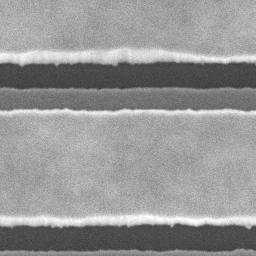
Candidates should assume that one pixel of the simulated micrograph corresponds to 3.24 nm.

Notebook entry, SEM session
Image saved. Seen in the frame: lines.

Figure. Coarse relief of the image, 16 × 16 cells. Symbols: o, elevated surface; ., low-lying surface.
oooooooooooooooo
oooooooooooooooo
oooooooooooooooo
oooooooooooooooo
................
................
................
oooooooooooooooo
oooooooooooooooo
oooooooooooooooo
oooooooooooooooo
oooooooooooooooo
oooooooooooooooo
oooooooooooooooo
................
................